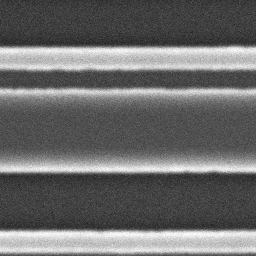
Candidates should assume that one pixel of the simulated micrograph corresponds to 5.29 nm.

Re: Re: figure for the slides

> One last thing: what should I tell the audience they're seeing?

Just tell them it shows lines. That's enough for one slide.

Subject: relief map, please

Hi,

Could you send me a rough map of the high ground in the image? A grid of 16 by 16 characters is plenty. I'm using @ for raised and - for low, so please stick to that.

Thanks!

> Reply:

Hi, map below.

----------------
----------------
----------------
@@@@@@@@@@@@@@@@
@@@@@@@@@@@@@@@@
@@@@@@@@@@@@@@@@
@@@@@@@@@@@@@@@@
@@@@@@@@@@@@@@@@
@@@@@@@@@@@@@@@@
@@@@@@@@@@@@@@@@
@@@@@@@@@@@@@@@@
----------------
----------------
----------------
----------------
@@@@@@@@@@@@@@@@